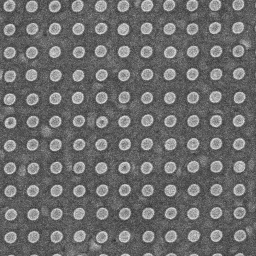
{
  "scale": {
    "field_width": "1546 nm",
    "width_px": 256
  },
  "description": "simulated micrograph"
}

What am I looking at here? a regular array of raised bodies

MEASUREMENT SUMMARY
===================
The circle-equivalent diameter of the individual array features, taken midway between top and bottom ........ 0.0682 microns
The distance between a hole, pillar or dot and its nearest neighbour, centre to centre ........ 136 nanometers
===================